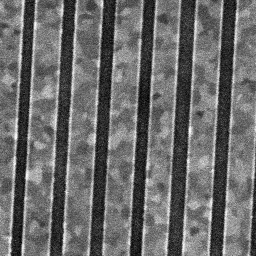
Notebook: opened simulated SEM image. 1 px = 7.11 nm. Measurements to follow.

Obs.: parallel lines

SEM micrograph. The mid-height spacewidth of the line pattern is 13.3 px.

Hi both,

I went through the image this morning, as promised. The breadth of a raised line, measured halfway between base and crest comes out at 189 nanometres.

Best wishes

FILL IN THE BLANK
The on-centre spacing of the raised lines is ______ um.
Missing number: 0.285